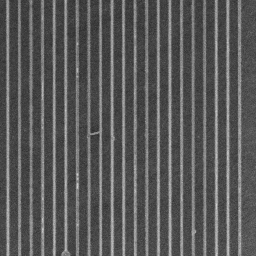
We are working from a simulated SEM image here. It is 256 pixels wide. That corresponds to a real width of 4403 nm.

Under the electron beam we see parallel lines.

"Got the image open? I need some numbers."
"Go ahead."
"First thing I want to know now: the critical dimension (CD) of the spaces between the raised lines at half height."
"166 nanometers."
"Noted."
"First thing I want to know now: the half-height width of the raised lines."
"30.1 nm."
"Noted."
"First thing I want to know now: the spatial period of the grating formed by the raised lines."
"200 nanometers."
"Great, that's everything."